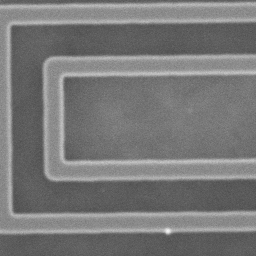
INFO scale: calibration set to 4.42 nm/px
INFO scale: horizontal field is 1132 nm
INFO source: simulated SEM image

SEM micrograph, groups of lines, slits or small figures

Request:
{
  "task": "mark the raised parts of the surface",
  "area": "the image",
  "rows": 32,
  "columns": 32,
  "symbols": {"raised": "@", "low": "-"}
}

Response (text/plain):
-------------------@@@@@@@@@@@@@
@@@@@@@@@@@@@@@@@@@@@@@@@@@@@@@@
@@@@@@@@@@@@@@@@@@@@@@@@@@@@@@@@
@-------------------------------
@-------------------------------
@-------------------------------
@-------------------------------
@-----@@@@@@@@@@@@@@@@@@@@@@@@@@
@-----@@@@@@@@@@@@@@@@@@@@@@@@@@
@-----@@------------------------
@-----@@------------------------
@-----@@------------------------
@-----@@------------------------
@-----@@------------------------
@-----@@------------------------
@-----@@------------------------
@-----@@------------------------
@-----@@------------------------
@-----@@------------------------
@-----@@------------------------
@-----@@@@@@@@@@@@@@@@@@@@@@@@@@
@-----@@@@@@@@@@@@@@@@@@@@@@@@@@
@-----@@@@@@--------------------
@-------------------------------
@-------------------------------
@-------------------------------
@@------------------------------
@@@@@@@@@@@@@@@@@@@@@@@@@@@@@@@@
@@@@@@@@@@@@@@@@@@@@@@@@@@@@@@@@
--------------------------------
--------------------------------
--------------------------------